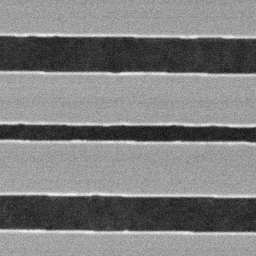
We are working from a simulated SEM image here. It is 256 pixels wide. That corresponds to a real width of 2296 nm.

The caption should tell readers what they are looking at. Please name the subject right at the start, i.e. lines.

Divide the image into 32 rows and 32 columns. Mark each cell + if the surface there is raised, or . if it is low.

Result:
++++++++++++++++++++++++++++++++
++++++++++++++++++++++++++++++++
++++++++++++++++++++++++++++++++
++++++++++++++++++++++++++++++++
................++++++++++++++++
................................
................................
................................
................................
++++++++++++++++++++++++++++++++
++++++++++++++++++++++++++++++++
++++++++++++++++++++++++++++++++
++++++++++++++++++++++++++++++++
++++++++++++++++++++++++++++++++
++++++++++++++++++++++++++++++++
........++++++++++++++++++++++++
................................
................................
++++++++++++++++++++++++++++++++
++++++++++++++++++++++++++++++++
++++++++++++++++++++++++++++++++
++++++++++++++++++++++++++++++++
++++++++++++++++++++++++++++++++
++++++++++++++++++++++++++++++++
...............+++++++++++++++++
................................
................................
................................
................................
++++++++++++++++++++++++++++++++
++++++++++++++++++++++++++++++++
++++++++++++++++++++++++++++++++